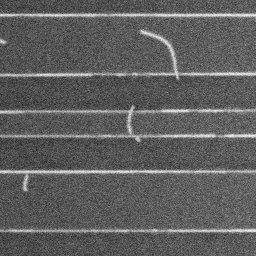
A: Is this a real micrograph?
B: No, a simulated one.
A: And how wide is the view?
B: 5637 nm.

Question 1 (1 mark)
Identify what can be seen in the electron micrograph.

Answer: lines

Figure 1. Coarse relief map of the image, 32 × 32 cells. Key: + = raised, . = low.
................................
................................
++++++++++++++++++++++++++++++++
++++++++++++++++++++++++++++++++
++++++++++++++++++++++++++++++++
++++++++++++++++++++++++++++++++
++++++++++++++++++++++++++++++++
++++++++++++++++++++++++++++++++
++++++++++++++++++++++++++++++++
................................
................................
................................
................................
................................
++++++++++++++++++++++++++++++++
++++++++++++++++++++++++++++++++
++++++++++++++++++++++++++++++++
................................
................................
................................
................................
++++++++++++++++++++++++++++++++
++++++++++++++++++++++++++++++++
++++++++++++++++++++++++++++++++
++++++++++++++++++++++++++++++++
++++++++++++++++++++++++++++++++
++++++++++++++++++++++++++++++++
++++++++++++++++++++++++++++++++
++++++++++++++++++++++++++++++++
................................
................................
................................